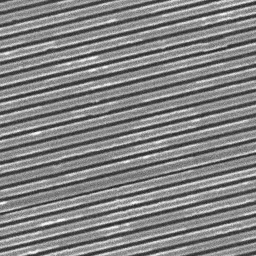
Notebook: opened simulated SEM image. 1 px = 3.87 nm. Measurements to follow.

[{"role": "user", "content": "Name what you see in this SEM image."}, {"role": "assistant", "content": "parallel lines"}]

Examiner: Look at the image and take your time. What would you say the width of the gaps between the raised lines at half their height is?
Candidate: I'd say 18.4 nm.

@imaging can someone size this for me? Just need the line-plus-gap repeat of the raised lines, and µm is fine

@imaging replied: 0.047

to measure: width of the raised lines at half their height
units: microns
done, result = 0.0301